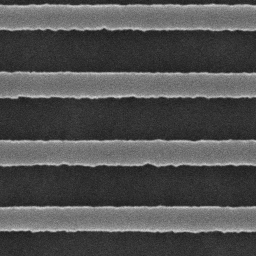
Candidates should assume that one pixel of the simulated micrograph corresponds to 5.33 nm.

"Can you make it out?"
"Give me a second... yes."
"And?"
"lines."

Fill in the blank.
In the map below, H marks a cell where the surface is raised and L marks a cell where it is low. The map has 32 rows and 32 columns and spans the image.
LLLLLLLLLLLLLLLLLLLLLLLLLLLLLLLL
HHHHHHHHHHHHHHHHHHHHHHHHHHHHHHHH
HHHHHHHHHHHHHHHHHHHHHHHHHHHHHHHH
HHHHHHHHHHHHHHHHHHHHHHHHHHHHHHHH
LLLLLLLLLLLLLLLLLLLLLLLLLLLLLLLL
LLLLLLLLLLLLLLLLLLLLLLLLLLLLLLLL
LLLLLLLLLLLLLLLLLLLLLLLLLLLLLLLL
LLLLLLLLLLLLLLLLLLLLLLLLLLLLLLLL
LLLLLLLLLLLLLLLLLLLLLLLLLLLLLLLL
HHHHHHHHHHHHHHHHHHHHHHHHHHHHHHHH
HHHHHHHHHHHHHHHHHHHHHHHHHHHHHHHH
HHHHHHHHHHHHHHHHHHHHHHHHHHHHHHHH
LLLLLLLLLLLLLLLLLLLLLLLLLLLLLLLL
LLLLLLLLLLLLLLLLLLLLLLLLLLLLLLLL
LLLLLLLLLLLLLLLLLLLLLLLLLLLLLLLL
LLLLLLLLLLLLLLLLLLLLLLLLLLLLLLLL
LLLLLLLLLLLLLLLLLLLLLLLLLLLLLLLL
LLLLLLLLLLLLLLLLLLLHLLLLLLLLLLLH
HHHHHHHHHHHHHHHHHHHHHHHHHHHHHHHH
HHHHHHHHHHHHHHHHHHHHHHHHHHHHHHHH
HHHHHHHHHHHHHHHHHHLHHHHHHHHHHHHH
LLLLLLLLLLLLLLLLLLLLLLLLLLLLLLLL
LLLLLLLLLLLLLLLLLLLLLLLLLLLLLLLL
LLLLLLLLLLLLLLLLLLLLLLLLLLLLLLLL
LLLLLLLLLLLLLLLLLLLLLLLLLLLLLLLL
LLLLLLLLLLLLLLLLLLLLLLLLLLLLLLLL
HHHHHHHHHHHHHHHHHHHHHHHHHHHHHHHH
HHHHHHHHHHHHHHHHHHHHHHHHHHHHHHHH
HHHHHHHHHHHHHHHHHHHHHHHHHHHHHHHH
LLLLLLLLLLLLLLLLLLLLLLLLLLLLLLLL
LLLLLLLLLLLLLLLLLLLLLLLLLLLLLLLL
LLLLLLLLLLLLLLLLLLLLLLLLLLLLLLLL